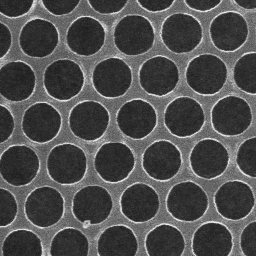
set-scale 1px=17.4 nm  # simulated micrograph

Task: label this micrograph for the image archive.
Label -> a regular array of holes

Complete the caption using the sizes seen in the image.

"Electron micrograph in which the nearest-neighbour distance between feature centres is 825 nm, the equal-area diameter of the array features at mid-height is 0.691 µm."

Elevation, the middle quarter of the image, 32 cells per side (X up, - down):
----XXXX--------XXX---------XXX-
----XXX----------XX---------XXX-
-----XX----------XX----------X--
-----XX----------XX----------XX-
-----XX----------XX----------XX-
-----XXX---------XX---------XXX-
----XXXX--------XXXX-------XXXXX
---XXXXXX------XXXXXX-----XXXXXX
--XXXXXXXXX-XXXXXXXXXXXXXXXX---X
XXXXX---XXXXXXXX-----XXXXXX-----
XXX-------XXXXX-------XXXX------
XX---------XXX---------XX-------
XX---------XX----------XX-------
X----------XX----------XX-------
X----------XX----------XX-------
XX---------XXX---------XX-------
XX---------XXX--------XXXX------
XX--------XXXXX------XXXXXX-----
XXXX-----XXXXX-XX---XXXXXXXXXXXX
XXXXXXXXXXX---XXXXXXXXX---XXXXX-
---XXXXXX-------XXXXX-------XXXX
-----XXXX--------XXX---------XXX
-----XXX---------X-X---------XXX
------XX---------X-X---------XX-
------X-----------XX---------XXX
------XX----------XX---------XXX
------XX---------XXX---------XXX
-----XXXX-------XXXXX-------XXXX
-----XXXX-------XXXXXX-----XXXXX
----XXXXXXXX-XXXXXXXXXXXXXXXXX--
XXXXXX---XXXXXXXX----XXXXXX-----
XXXX------XXXXX--------XXXX-----